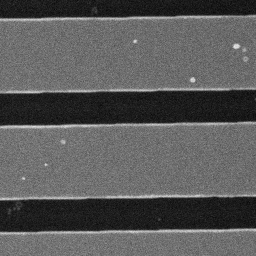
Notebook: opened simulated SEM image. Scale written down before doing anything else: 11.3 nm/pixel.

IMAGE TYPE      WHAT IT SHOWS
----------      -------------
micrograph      lines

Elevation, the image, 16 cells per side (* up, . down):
................
****************
****************
****************
****************
****************
................
................
****************
****************
****************
****************
................
................
..**************
****************